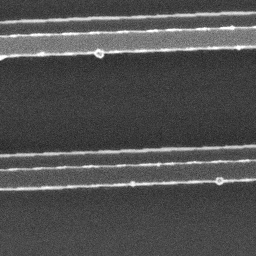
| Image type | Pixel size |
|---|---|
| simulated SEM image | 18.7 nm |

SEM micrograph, lines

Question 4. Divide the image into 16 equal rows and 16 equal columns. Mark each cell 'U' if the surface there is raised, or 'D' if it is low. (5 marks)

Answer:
DDDDDDDDDDDDDDDD
UUUUUUUUUUUUUUUU
UUUUUUUUUUUUUUUU
UDDDDDDDDDDDDDDD
DDDDDDDDDDDDDDDD
DDDDDDDDDDDDDDDD
DDDDDDDDDDDDDDDD
DDDDDDDDDDDDDDDD
DDDDDDDDDDDDDDDD
DDDDDDDDUUUUUUUU
UUUUUUUUUUUUUUUU
UUUUUUUUUDDDDDDD
DDDDDDDDDDDDDDDD
DDDDDDDDDDDDDDDD
DDDDDDDDDDDDDDDD
DDDDDDDDDDDDDDDD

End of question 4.